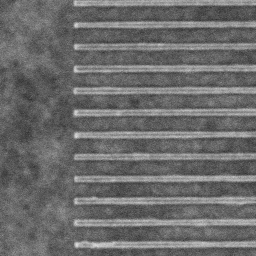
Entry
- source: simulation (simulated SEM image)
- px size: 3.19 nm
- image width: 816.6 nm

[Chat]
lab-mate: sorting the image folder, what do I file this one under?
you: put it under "parallel lines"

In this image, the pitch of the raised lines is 70.1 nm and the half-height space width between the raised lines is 54.6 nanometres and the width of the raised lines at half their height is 14.3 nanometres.